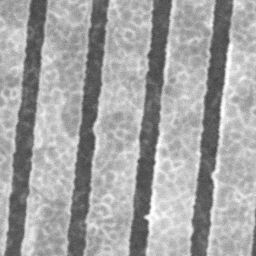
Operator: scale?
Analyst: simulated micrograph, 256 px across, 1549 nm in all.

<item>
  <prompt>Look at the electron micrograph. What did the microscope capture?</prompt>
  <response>one or a few lines or trenches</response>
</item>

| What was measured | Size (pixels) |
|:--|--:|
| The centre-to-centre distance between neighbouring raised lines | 61.2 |